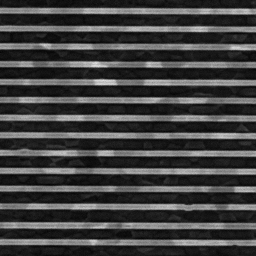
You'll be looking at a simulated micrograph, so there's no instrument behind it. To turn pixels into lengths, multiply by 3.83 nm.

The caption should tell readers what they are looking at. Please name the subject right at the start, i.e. parallel lines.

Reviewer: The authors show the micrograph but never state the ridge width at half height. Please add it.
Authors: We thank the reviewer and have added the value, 21.1 nanometers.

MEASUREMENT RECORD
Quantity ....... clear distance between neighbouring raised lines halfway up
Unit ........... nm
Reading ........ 46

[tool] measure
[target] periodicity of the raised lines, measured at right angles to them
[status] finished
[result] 68.2 nanometers